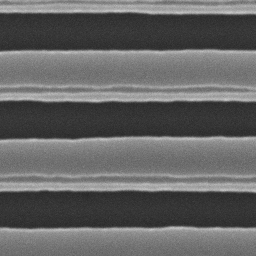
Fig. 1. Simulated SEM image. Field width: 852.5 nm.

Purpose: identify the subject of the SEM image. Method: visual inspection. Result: lines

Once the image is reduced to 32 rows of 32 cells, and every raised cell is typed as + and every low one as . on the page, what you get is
++++++++++++++++++++++++++++++++
..................++++++++++++++
................................
................................
................................
................................
.+++++++++++++++++++++++++++++++
++++++++++++++++++++++++++++++++
++++++++++++++++++++++++++++++++
++++++++++++++++++++++++++++++++
++++++++++++++++++++++++++++++++
++++++++++++++++++++++++++++++++
.....+++++++++++++++++.++...+.++
................................
................................
................................
................................
...++.....++++++++++++++++++++++
++++++++++++++++++++++++++++++++
++++++++++++++++++++++++++++++++
++++++++++++++++++++++++++++++++
++++++++++++++++++++++++++++++++
++++++++++++++++++++++++++++++++
++++++++++++++++++++++++++++++++
................................
................................
................................
................................
.....................++.........
++++++++++++++++++++++++++++++++
++++++++++++++++++++++++++++++++
++++++++++++++++++++++++++++++++